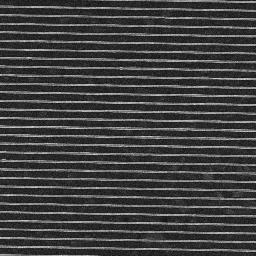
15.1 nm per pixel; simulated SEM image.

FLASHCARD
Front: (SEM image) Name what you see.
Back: parallel lines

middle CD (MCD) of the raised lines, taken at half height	24.5	nanometres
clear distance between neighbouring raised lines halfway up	104	nm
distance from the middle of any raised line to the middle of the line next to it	129	nanometers